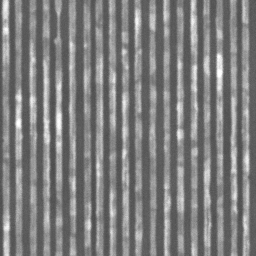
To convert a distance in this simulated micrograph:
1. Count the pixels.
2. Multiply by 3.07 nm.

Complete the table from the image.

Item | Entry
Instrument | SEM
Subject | parallel lines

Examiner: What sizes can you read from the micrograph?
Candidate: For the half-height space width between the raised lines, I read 23.8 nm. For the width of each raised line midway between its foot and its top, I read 15.7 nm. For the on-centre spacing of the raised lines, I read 40.9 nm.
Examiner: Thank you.